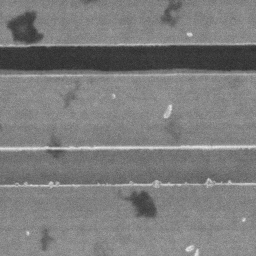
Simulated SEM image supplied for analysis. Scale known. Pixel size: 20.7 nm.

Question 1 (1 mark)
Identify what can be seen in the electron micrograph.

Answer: lines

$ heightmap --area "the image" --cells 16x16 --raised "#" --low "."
################
################
################
................
................
################
################
################
################
################
################
################
################
################
################
################